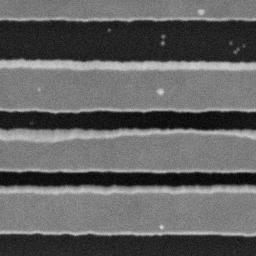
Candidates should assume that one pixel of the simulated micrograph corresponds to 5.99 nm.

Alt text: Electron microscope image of lines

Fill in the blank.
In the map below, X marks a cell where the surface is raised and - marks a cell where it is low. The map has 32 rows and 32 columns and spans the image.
XXXXXXXXXXXXXXXXXXXXXXXXXXXXXXXX
XXXXXXXXXXXXXXXXXXXXXXXXXXXXXXXX
--XXXX--XXXXXXXXX--XX-----XX--XX
--------------------------------
--------------------------------
--------------------------------
--------------------------------
--------------------------------
XXXXXXXXXXXXXXXXXXXXXXXXXXXXXXXX
XXXXXXXXXXXXXXXXXXXXXXXXXXXXXXXX
XXXXXXXXXXXXXXXXXXXXXXXXXXXXXXXX
XXXXXXXXXXXXXXXXXXXXXXXXXXXXXXXX
XXXXXXXXXXXXXXXXXXXXXXXXXXXXXXXX
XXXXXXXXXXXXXXXXXXXXXXXXXXXXXXXX
--------------------------------
--------------------------------
---------------XXXXXXXXXXXXXXX--
XXXXXXXXXXXXXXXXXXXXXXXXXXXXXXXX
XXXXXXXXXXXXXXXXXXXXXXXXXXXXXXXX
XXXXXXXXXXXXXXXXXXXXXXXXXXXXXXXX
XXXXXXXXXXXXXXXXXXXXXXXXXXXXXXXX
-------------------XX-X----XXX--
--------------------------------
-XXXX---X-XX--X--X-XX-XXX-XXXXXX
XXXXXXXXXXXXXXXXXXXXXXXXXXXXXXXX
XXXXXXXXXXXXXXXXXXXXXXXXXXXXXXXX
XXXXXXXXXXXXXXXXXXXXXXXXXXXXXXXX
XXXXXXXXXXXXXXXXXXXXXXXXXXXXXXXX
XXXXXXXXXXXXXXXXXXXXXXXXXXXXXXXX
--------------------------------
--------------------------------
--------------------------------